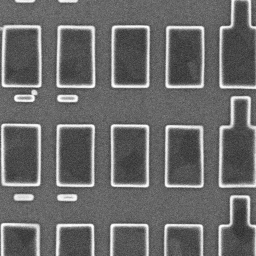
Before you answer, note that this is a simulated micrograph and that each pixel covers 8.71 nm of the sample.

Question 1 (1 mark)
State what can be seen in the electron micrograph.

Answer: wiring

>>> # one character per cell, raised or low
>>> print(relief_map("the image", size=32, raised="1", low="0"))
00000000000000000000000000000110
00000000000000000000000000000110
00000000000000000000000000000110
01111000111000111100011110001111
01111001111100111110011110001111
11111001111100111110011110001111
11111001111100111110011110001111
11111001111100111110011110001111
11111001111100111110011110001111
11111001111100111110011110001111
11111001111100111100011110001111
00000000000000000000000000000000
00110000100000000000000000000110
00000000000000000000000000000110
00000000000000000000000000000110
00000000000000000000000000000110
11111001111100111110011110001111
11111001111100111110011110001111
11111001111100111100011110001111
11111001111100111100011110001111
11111001111100111100011110001111
11111001111100111100011110001111
11111001111100111100011110001111
00000000000000000000000000000000
00000000000000000000000000000000
00000000000000000000000000000110
00000000000000000000000000000110
00000000000000000000000000000110
11111001111100111100011110001111
11111001111100111100011110001111
11111001111100111100011110001111
11111001111100111100011110001111